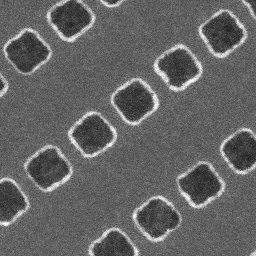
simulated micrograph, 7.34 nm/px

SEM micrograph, a regular array of raised bodies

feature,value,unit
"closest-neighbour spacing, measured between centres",406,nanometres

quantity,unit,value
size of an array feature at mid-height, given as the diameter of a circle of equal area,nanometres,315